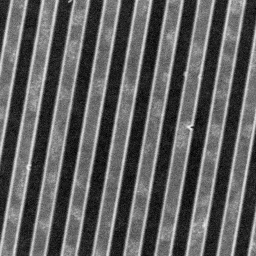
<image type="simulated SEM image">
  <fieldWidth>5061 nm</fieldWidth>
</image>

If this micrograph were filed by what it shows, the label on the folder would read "parallel lines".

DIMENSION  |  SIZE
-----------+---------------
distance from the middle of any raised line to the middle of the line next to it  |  608 nm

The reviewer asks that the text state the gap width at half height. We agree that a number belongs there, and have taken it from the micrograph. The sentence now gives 317 nanometres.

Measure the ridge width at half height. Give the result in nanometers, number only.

300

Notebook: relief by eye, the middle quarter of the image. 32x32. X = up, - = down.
XXX-----XXX----XXXX----XXXX----X
XXX----XXXX----XXXX----XXXX----X
XXX----XXXX----XXXX----XXX----XX
XXX----XXXX----XXX-----XXX----XX
XXX----XXX-----XXX----XXXX----XX
XXX----XXX----XXXX----XXXX----XX
XX-----XXX----XXXX----XXXX----XX
XX----XXXX----XXXX----XXXX----XX
XX----XXXX----XXXX----XXXX---XXX
XX----XXXX----XXX-----XXX----XXX
XX----XXX-----XXX----XXXX----XXX
XX----XXX----XXXX----XXXX----XXX
X-----XXX----XXXX----XXXX----XXX
X----XXXX----XXXX----XXX-----XXX
X----XXXX----XXXX----XXX----XXXX
X----XXXX----XXX-----XXX----XXXX
-----XXX-----XXX----XXXX----XXXX
X----XXX----XXXX----XXXX----XXXX
-----XXX----XXXX----XXXX----XXXX
----XXXX----XXXX----XXX-----XXX-
----XXXX----XXXX----XXX----XXXX-
----XXXX----XXX-----XXX----XXXX-
----XXX-----XXX----XXXX----XXXX-
----XXX----XXXX----XXXX----XXXX-
---XXXX----XXXX----XXXX----XXX--
---XXXX----XXXX----XXX-----XXX--
---XXXX----XXXX----XXX----XXXX--
---XXX-----XXX-----XXX----XXXX--
---XXX-----XXX----XXXX----XXXX--
---XXX-----XXX----XXXX----XXXX--
--XXXX----XXXX----XXXX----XXX---
--XXXX----XXXX----XXXX----XXX---